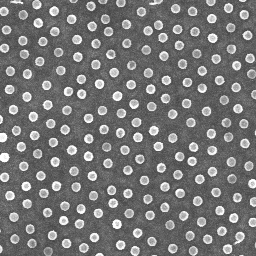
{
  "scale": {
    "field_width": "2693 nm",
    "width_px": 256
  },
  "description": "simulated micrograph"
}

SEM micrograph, a regular array of raised bodies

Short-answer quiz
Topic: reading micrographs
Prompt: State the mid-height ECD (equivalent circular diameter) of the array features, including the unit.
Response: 94.2 nanometres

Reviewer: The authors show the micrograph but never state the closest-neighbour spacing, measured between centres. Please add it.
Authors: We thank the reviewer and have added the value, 180 nm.